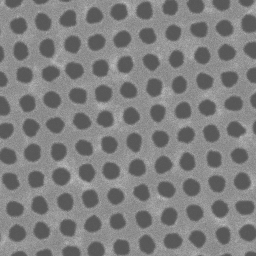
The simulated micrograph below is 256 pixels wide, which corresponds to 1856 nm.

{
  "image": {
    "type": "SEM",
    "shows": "a regular array of holes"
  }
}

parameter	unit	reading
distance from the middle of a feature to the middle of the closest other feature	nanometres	182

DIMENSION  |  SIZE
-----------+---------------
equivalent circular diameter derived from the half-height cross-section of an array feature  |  0.126 um